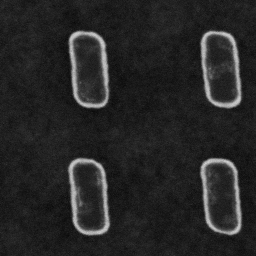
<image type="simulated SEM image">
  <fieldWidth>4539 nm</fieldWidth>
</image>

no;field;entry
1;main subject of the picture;raised bodies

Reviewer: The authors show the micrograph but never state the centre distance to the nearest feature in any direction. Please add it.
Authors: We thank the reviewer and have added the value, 2260 nanometres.